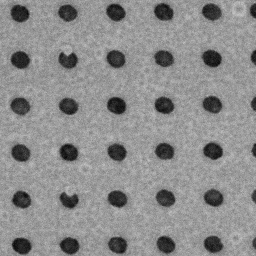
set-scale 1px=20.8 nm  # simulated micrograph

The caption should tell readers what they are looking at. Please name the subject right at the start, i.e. a regular array of holes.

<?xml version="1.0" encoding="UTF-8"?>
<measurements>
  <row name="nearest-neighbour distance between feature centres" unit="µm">0.967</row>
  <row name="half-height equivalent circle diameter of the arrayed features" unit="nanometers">395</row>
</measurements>